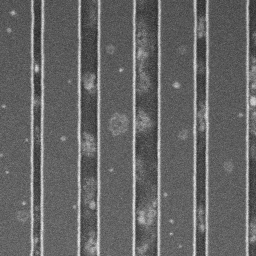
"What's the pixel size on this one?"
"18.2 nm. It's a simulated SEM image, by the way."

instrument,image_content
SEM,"parallel lines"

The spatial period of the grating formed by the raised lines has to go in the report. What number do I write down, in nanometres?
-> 1010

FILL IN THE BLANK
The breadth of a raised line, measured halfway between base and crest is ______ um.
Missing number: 0.67